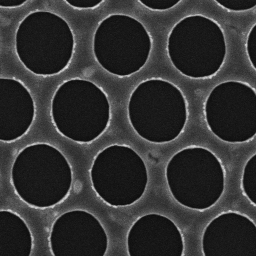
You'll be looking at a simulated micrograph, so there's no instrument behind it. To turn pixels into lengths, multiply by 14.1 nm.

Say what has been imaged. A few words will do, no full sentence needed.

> a regular array of holes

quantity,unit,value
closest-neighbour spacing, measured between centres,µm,1.06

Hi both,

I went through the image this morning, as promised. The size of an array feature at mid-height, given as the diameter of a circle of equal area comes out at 840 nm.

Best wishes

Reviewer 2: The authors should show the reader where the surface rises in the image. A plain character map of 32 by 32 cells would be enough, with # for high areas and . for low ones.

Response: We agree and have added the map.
...######...######....######....
####..##########################
###.....#####....######...######
##.......###......####.....#####
##.......###.......##.......###.
##.......###.......##.......###.
##.......###.......##.......###.
###......###......###.......###.
###.....#####.....####.....#####
########################..######
...#####....######...#######..##
....###......####......###......
....###......###.......###......
....##........##.......###......
....###.......##.......###......
....###......###.......###......
...#####.....####......####.....
.########...######...#######...#
###....######...########.#######
##......####.....#####.....#####
##.......###......###......####.
#........##.......###.......###.
##.......##.......###.......##..
##.......###......###.......##..
##......#####.....####......###.
####...#######..#######....#####
.########..#####################
...####.....#####....######....#
...####......###......####......
....##.......###.......##.......
....##.......###.......##.......
....###......###.......##.......